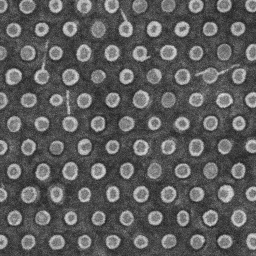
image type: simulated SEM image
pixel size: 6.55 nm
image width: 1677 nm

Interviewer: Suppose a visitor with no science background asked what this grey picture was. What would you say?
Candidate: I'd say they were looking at a regular array of raised bodies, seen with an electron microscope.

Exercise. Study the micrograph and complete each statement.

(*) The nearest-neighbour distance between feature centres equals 177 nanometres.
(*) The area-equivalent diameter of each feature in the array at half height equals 94.4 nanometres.